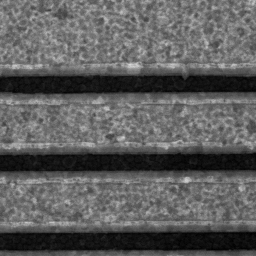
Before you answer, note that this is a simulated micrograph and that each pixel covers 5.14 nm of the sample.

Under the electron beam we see one or a few lines or trenches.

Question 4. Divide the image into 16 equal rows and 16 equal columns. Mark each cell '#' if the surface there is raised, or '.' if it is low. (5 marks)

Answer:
################
################
################
################
................
................
################
################
################
................
................
################
################
################
................
................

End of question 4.